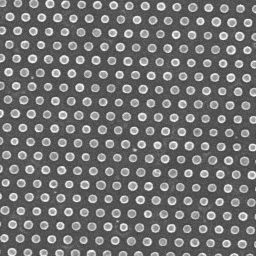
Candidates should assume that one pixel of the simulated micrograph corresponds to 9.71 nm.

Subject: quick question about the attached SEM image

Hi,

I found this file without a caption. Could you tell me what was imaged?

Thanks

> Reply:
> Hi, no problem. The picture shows a regular array of raised bodies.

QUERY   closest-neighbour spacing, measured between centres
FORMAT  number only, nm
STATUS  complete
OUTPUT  151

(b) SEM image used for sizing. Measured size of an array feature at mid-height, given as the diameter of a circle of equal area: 75.9 nm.